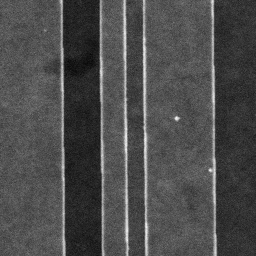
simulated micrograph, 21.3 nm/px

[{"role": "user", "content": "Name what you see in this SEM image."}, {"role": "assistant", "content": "lines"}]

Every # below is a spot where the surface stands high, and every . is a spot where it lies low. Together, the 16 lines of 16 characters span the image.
####..#######...
####..#######...
####..#######...
####..#######...
####..#######...
####..#######...
####..#######...
####..#######...
####..#######...
####..#######...
####..#######...
####..#######...
####..#######...
####..#######...
####..#######...
####..#######...